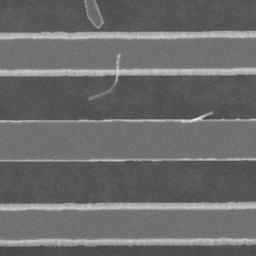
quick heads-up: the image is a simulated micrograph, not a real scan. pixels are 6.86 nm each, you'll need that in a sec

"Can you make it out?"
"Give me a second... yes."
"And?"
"lines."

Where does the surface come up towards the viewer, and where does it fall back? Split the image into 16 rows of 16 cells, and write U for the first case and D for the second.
DDDDDDDDDDDDDDDD
DDDDDDDDDDDDDDDD
UUUUUUUUUUUUUUUU
UUUUUUUUUUUUUUUU
UUUUUUUUUUUUUUUU
DDDDDDDDDDDDDDDD
DDDDDDDDDDDDDDDD
DDDDDDDDDDDDUUUU
UUUUUUUUUUUUUUUU
UUUUUUUUUUUUUUUU
DDDDDDDDDDDDDDDD
DDDDDDDDDDDDDDDD
DDDDDDDDDDDDDDDD
UUUUUUUUUUUUUUUU
UUUUUUUUUUUUUUUU
DDDDDDDDDDDDDDDD